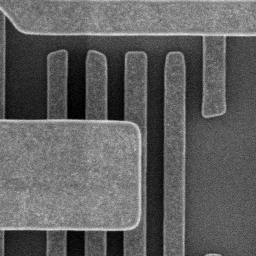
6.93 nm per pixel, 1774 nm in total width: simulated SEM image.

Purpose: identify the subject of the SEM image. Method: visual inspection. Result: wiring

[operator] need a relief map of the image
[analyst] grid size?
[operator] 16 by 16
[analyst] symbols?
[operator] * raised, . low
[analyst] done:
****************
.***************
................
................
................
................
................
...**...........
*********.......
*********.......
*********.......
*********.......
*********.......
*********.......
................
................